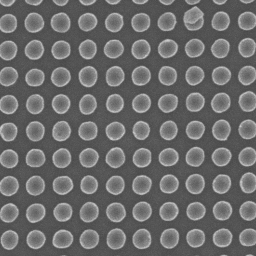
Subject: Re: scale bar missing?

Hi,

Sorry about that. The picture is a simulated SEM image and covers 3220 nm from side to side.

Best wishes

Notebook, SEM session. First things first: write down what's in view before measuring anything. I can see a regular array of raised bodies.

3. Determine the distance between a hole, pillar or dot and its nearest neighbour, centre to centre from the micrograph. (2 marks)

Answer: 331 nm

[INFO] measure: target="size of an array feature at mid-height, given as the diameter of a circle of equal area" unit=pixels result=18.6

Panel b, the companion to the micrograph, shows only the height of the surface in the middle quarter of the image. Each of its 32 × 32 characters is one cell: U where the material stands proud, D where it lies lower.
DDDDDDDDDDDDDDDDDDDDDDDDDDDDDDDD
UDDDUUUUDDDUUUDDDDUUUDDDUUUDDDDU
UDDDUUUUDDDUUUUDDUUUUDDDUUUUDDDU
UDDDUUUUDDDUUUUDDUUUUDDDUUUUDDDU
UDDDUUUUDDDUUUDDDUUUUDDDUUUUDDDU
DDDDDDDDDDDDDDDDDDDDDDDDDDDDDDDD
DDDDDDDDDDDDDDDDDDDDDDDDDDDDDDDD
DDDDDDDDDDDDDDDDDDDDDDDDDDDDDDDU
UDDDUUUDDDDUUUDDDDUUUDDDUUUUDDDU
UDDDUUUUDDDUUUUDDUUUUUDDUUUUDDDU
UDDDUUUUDDDUUUUDDUUUUUDDUUUUDDDU
UDDDUUUUDDDUUUDDDDUUUDDDUUUUDDDD
DDDDDDDDDDDDDDDDDDDDDDDDDDDDDDDD
DDDDDDDDDDDDDDDDDDDDDDDDDDDDDDDD
DDDDDDUDDDDDDDDDDDDUDDDDDDUDDDDD
UDDDUUUUDDDUUUUDDDUUUDDDDUUUDDDU
UUDDUUUUDDDUUUUDDUUUUDDDUUUUDDDU
UDDDUUUUDDDUUUUDDDUUUDDDUUUUDDDU
UDDDDUUDDDDUUUDDDDUUDDDDDUUDDDDD
DDDDDDDDDDDDDDDDDDDDDDDDDDDDDDDD
DDDDDDDDDDDDDDDDDDDDDDDDDDDDDDDD
UDDDDUUUDDDDUUDDDDDUUDDDDUUDDDDU
UDDDUUUUDDDUUUUDDDUUUUDDUUUUDDDU
UUDDUUUUUDDUUUUDDUUUUUDDUUUUDDDU
UUDDUUUUDDDUUUUDDUUUUDDDUUUUDDDU
UDDDDUUDDDDDUUDDDDUUDDDDDDDDDDDD
DDDDDDDDDDDDDDDDDDDDDDDDDDDDDDDD
DDDDDDDDDDDDDDDDDDDDDDDDDDDDDDDD
UDDDDUUUDDDDUUDDDDUUUDDDDUUUDDDU
UUDDUUUUDDDUUUUDDUUUUUDDUUUUDDDU
UUDDUUUUDDDUUUUDDUUUUUDDUUUUDDDU
UUDDDUUUDDDUUUUDDUUUUDDDUUUUDDDU